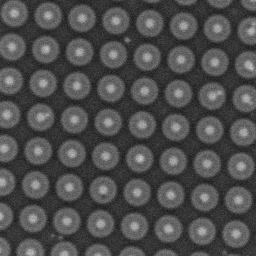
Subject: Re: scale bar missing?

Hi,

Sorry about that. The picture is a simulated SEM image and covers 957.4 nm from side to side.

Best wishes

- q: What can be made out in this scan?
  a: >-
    an array of small figures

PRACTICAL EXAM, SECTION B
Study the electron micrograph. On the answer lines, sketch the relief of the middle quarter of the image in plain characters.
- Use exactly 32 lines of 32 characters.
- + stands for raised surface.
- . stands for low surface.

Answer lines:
...........+++....+++++...++++++
....................++.....++++.
..+++...........................
.+++++....++++......+...........
++++++...++++++...+++++....+++..
+++++++.+++++++..++++++...+++++.
++++++..+++++++..++++++..+++++++
.+++++...++++++..++++++..+++++++
..+++....+++++...++++++..+++++++
..................++++....+++++.
...........................+++..
+++++.....++....................
++++++..++++++....+++...........
++++++..++++++...+++++....++++..
++++++..++++++..+++++++..++++++.
++++++..++++++..+++++++..++++++.
+++++...++++++..+++++++..++++++.
..........+++....+++++...++++++.
..........................++++..
++++............................
+++++...+++++.....++............
+++++..++++++...+++++.....+++...
+++++..+++++++..++++++...+++++..
+++++..+++++++..++++++..+++++++.
+++++..++++++...++++++..+++++++.
.++.....+++++...++++++..++++++..
.................++++....+++++..
..........................++....
++++....+++.....................
++++...+++++....++++......+.....
+++++..++++++..++++++...+++++...
+++++..++++++..+++++++..++++++..